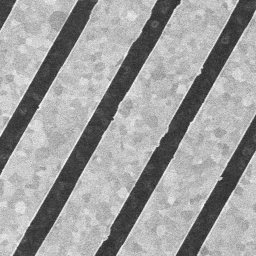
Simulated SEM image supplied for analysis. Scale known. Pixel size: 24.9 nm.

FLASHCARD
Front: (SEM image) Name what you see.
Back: one or a few lines or trenches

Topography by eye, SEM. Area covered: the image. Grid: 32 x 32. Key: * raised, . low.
..*******...*******...********..
.********...*******...*******...
.*******...*******...*******...*
********...*******...*******...*
*******...*******...*******...**
*******...******....*******...**
******...*******...*******...***
*****...*******...********...***
*****...*******...*******...****
****...*******...********..*****
****...*******...*******...*****
***...*******...*******...******
***..********..********...******
**...*******...*******...*******
*...*******...********...*******
*...*******...*******...*******.
...*******...********..********.
...*******...*******...*******..
..*******...*******...*******...
.********...*******...*******...
.*******...*******...*******...*
*******...********...*******...*
*******...*******...*******...**
******...********...*******..***
******...*******...*******...***
*****...*******...*******...****
*****...*******...*******...****
****...*******...*******...*****
***....*******...*******...*****
***...*******...*******...******
**...********..********..*******
**...*******...*******...*******